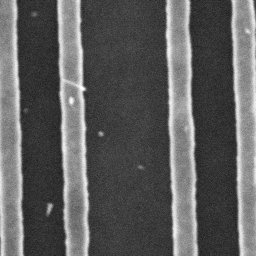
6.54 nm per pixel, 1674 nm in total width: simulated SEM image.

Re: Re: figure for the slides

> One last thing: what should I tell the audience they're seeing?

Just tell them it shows lines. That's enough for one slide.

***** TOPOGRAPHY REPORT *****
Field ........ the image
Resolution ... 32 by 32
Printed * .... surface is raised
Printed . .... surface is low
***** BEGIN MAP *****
**.....***...........***.....***
**.....***...........***.....***
**.....***...........***.....***
**.....***...........***.....***
**.....***...........***.....***
**.....***...........***.....***
**......**...........***.....***
**.....***...........***.....***
**.....***...........***.....***
**......**...........***.....***
**......**...........***.....***
**......**...........***.....***
**......**...........***.....***
**......**...........***......**
**......**...........***......**
**......***..........***......**
***.....***..........***......**
***.....***..........***......**
***.....***..........***......**
***.....***..........***......**
***.....***..........***......**
***.....***..........***......**
***.....***..........***......**
***.....***..........***......**
***.....***...........**......**
***.....***...........**......**
***.....***...........**......**
***.....***...........**......**
***.....***...........**......**
***.....***...........**......**
***.....***...........***.....**
***.....***...........***.....**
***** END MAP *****